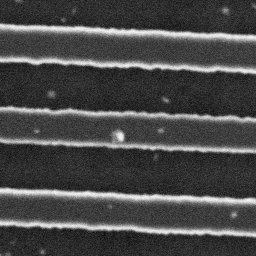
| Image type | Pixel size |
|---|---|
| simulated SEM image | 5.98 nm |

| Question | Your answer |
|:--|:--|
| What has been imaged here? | lines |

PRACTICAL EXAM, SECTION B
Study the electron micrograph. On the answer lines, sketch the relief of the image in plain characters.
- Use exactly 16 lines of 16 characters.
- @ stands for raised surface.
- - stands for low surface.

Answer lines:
----------------
----------------
@@@@@@@@@@@@@@@@
@@@@@@@@@@@@@@@@
---------------@
----------------
----------------
@@@@@@@@@@@@@@@@
@@@@@@@@@@@@@@@@
----------------
----------------
----------------
@@@@@@@@@@@@@@@@
@@@@@@@@@@@@@@@@
---------@@@@@@@
----------------